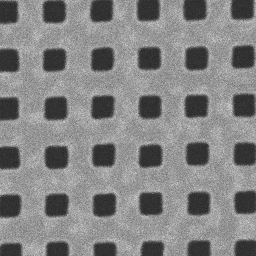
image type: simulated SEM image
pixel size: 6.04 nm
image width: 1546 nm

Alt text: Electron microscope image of a regular array of holes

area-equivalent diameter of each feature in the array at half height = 157 nanometres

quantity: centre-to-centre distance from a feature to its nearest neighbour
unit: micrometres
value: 0.284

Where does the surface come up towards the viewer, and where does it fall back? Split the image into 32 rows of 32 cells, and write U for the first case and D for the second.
DDUUUDDDUUUDDDUUUDDDUUUDDDUUUDDD
DDUUUDDDUUUDDDUUUDDDUUUDDDUUUDDD
DDUUUDDDUUUDDDUUUDDDUUUDDUUUUDDU
UUUUUUUUUUUUUUUUUUUUUUUUUUUUUUUU
UUUUUUUUUUUUUUUUUUUUUUUUUUUUUUUU
UUUUUUUUUUUUUUUUUUUUUUUUUUUUUUUU
DDUUUDDDUUUUDDUUUDDDUUUDDDUUUDDD
DDUUUDDDUUUDDDUUUDDDUUUDDDUUUDDD
DDUUUDDDUUUDDDUUUUDDUUUDDDUUUDDU
UUUUUUUUUUUUUUUUUUUUUUUUUUUUUUUU
UUUUUUUUUUUUUUUUUUUUUUUUUUUUUUUU
UUUUUUUUUUUUUUUUUUUUUUUUUUUUUUUU
DDUUUUDDUUUDDDUUUDDDUUUDDDUUUDDD
DDUUUDDDUUUDDDUUUDDDUUUDDDUUUDDD
DDUUUUDDUUUDDDUUUDDDUUUDDDUUUDDD
UUUUUUUUUUUUUUUUUUUUUUUUUUUUUUUU
UUUUUUUUUUUUUUUUUUUUUUUUUUUUUUUU
UUUUUUUUUUUUUUUUUUUUUUUUUUUUUUUU
DDUUUUDDUUUUDDUUUUDDUUUDDDUUUDDD
DDUUUDDDDUUDDDUUUDDDUUUDDDUUUDDD
DDUUUUDDUUUUDDUUUDDDUUUUDDUUUUDD
UUUUUUUUUUUUUUUUUUUUUUUUUUUUUUUU
UUUUUUUUUUUUUUUUUUUUUUUUUUUUUUUU
UUUUUUUUUUUUUUUUUUUUUUUUUUUUUUUU
DDUUUUDDUUUUDDUUUDDDUUUDDDUUUDDD
DDDUUUDDDUUUDDDUUDDDUUUDDDUUUDDD
DDDUUUDDUUUUDDUUUDDDUUUDDDUUUUDD
UUUUUUUUUUUUUUUUUUUUUUUUUUUUUUUU
UUUUUUUUUUUUUUUUUUUUUUUUUUUUUUUU
UUUUUUUUUUUUUUUUUUUUUUUUUUUUUUUU
DDDUUUDDUUUUDDUUUUDDUUUUDDUUUDDD
DDDUUUDDDUUUDDDUUUDDUUUDDDUUUDDD